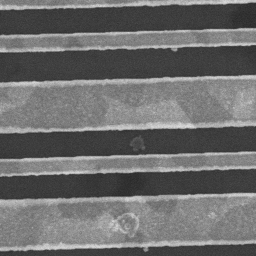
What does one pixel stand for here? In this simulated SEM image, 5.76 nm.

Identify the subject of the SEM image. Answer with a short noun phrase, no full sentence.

lines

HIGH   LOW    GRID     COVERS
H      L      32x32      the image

HHHHHHHHHHHHHHHHHHHHHLLLLLLLLLLL
LLLLLLLLLLLLLLLLLLLLLLLLLLLLLLLL
LLLLLLLLLLLLLLLLLLLLLLLLLLLLLLLL
LLLLLLLLLLLLLLLLLLLLLLLLLLLLLLLL
LHHHHHHHHHHHHHHHHHHHHHHHHHHHHHHH
HHHHHHHHHHHHHHHHHHHHHHHHHHHHHHHH
LLLLLLLLLLLLLLLLLLLLLLLLLLLLLLLL
LLLLLLLLLLLLLLLLLLLLLLLLLLLLLLLL
LLLLLLLLLLLLLLLLLLLLLLLLLLLLLLLL
LLLLLLLLLLLLLLLLLLLLLLLLLLLLLLLH
HHHHHHHHHHHHHHHHHHHHHHHHHHHHHHHH
HHHHHHHHHHHHHHHHHHHHHHHHHHHHHHHH
HHHHHHHHHHHHHHHHHHHHHHHHHHHHHHHH
HHHHHHHHHHHHHHHHHHHHHHHHHHHHHHHH
HHHHHHHHHHHHHHHHHHHHHHHHHHHHHHHH
HHHHHHHHHHHHHHHHHHHHHHHHHHHHHHHH
LLHLLLLLLLLLLLLLLLLLLLLLLLLLLLLL
LLLLLLLLLLLLLLLLLLLLLLLLLLLLLLLL
LLLLLLLLLLLLLLLLLLLLLLLLLLLLLLLL
LLLLLLLLLLLLLLHHHHHHHHHHHHHHHHHH
HHHHHHHHHHHHHHHHHHHHHHHHHHHHHHHH
HHHHHHHHHHHHHHHHHLLLLLLLLLLLLLLL
LLLLLLLLLLLLLLLLLLLLLLLLLLLLLLLL
LLLLLLLLLLLLLLLLLLLLLLLLLLLLLLLL
LLLLLLLLLLLLLLLLLLLLLLLHHHHHHHHH
HHHHHHHHHHHHHHHHHHHHHHHHHHHHHHHH
HHHHHHHHHHHHHHHHHHHHHHHHHHHHHHHH
HHHHHHHHHHHHHHHHHHHHHHHHHHHHHHHH
HHHHHHHHHHHHHHHHHHHHHHHHHHHHHHHH
HHHHHHHHHHHHHHHHHHHHHHHHHHHHHHHH
HHHHHHHHHHHHHHHHHHHHHHHHHHHHLLLL
LLLLLLLLLLLLLLLLLLLLLLLLLLLLLLLL